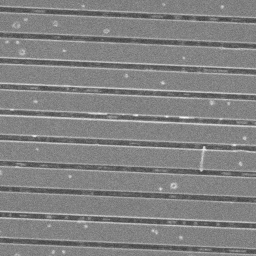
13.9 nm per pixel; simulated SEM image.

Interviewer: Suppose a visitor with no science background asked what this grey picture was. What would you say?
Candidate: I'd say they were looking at parallel lines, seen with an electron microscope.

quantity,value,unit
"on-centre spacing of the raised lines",356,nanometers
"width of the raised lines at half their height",273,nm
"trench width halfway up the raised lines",77.9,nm